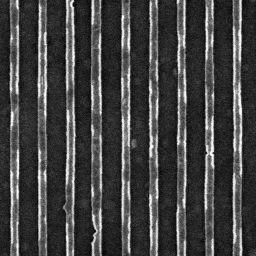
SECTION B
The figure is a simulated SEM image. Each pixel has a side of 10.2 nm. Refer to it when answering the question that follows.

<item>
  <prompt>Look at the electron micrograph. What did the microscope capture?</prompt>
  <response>parallel lines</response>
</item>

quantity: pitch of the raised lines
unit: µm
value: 0.284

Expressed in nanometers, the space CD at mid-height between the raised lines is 204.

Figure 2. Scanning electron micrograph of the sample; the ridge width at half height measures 80.3 nanometers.